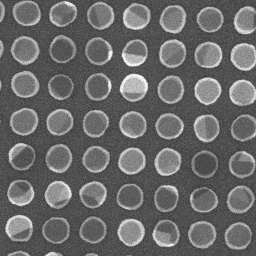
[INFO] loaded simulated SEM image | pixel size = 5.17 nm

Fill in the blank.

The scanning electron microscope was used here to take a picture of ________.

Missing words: a regular array of raised bodies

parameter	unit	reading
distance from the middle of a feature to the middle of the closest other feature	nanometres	183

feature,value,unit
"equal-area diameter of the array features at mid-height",0.13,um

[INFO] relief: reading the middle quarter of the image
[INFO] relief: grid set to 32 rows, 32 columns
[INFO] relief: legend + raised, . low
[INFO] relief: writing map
................................
................................
........+.......................
+.....+++++.....++++......++....
++....+++++....+++++....+++++...
++....++++++..+++++++...+++++...
++....+++++...+++++++...++++++..
++....+++++....+++++....+++++...
.......+++.....++++.....+++++...
.........................++.....
................................
................................
+.....++++......+++.............
++...++++++....+++++....+++++...
++...++++++...++++++...++++++...
++...++++++...++++++...+++++++..
+....+++++.....+++++...+++++++..
......++++.....+++++....+++++...
................................
................................
................................
+.....++++......+++......++.....
++...++++++....+++++....++++....
++...++++++...++++++...++++++...
++...++++++...++++++...++++++...
+....+++++....++++++...++++++...
.......++......++++.....++++....
.........................++.....
................................
................................
+....+++++.....+++..............
+...++++++....+++++....+++++....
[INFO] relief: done